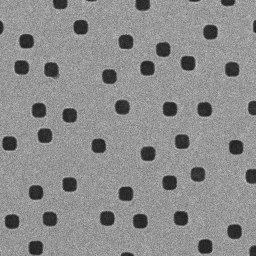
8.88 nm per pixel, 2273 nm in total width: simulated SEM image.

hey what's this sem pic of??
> a regular array of holes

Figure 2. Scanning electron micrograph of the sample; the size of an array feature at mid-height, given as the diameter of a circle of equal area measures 140 nm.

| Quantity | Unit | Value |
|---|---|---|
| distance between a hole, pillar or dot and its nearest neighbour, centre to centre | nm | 291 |